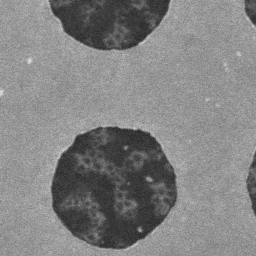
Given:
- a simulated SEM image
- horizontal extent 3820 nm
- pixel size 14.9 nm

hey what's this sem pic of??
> holes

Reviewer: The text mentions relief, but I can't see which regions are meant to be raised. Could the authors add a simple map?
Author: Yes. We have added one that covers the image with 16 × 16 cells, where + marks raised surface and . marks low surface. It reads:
+++........++++.
++++......++++++
+++++....+++++++
++++++++++++++++
++++++++++++++++
++++++++++++++++
++++++++++++++++
++++++++++++++++
+++++.....++++++
++++......++++++
+++........+++++
+++........++++.
+++........+++++
++++......++++++
++++.....+++++++
++++++..++++++++